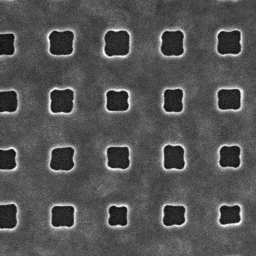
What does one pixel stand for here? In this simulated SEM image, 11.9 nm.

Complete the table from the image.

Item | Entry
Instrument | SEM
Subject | a regular array of holes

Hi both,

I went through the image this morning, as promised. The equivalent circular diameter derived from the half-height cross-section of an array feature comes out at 0.294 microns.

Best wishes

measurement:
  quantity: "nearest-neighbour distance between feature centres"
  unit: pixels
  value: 55.2